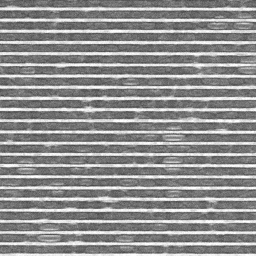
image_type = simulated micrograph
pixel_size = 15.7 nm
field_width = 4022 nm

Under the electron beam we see parallel lines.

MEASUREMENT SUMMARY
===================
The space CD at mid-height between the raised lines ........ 9.38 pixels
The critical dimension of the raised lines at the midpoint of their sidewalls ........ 0.0295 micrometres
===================